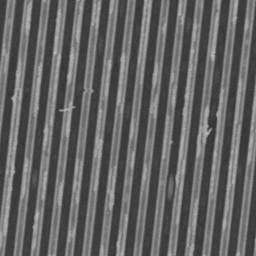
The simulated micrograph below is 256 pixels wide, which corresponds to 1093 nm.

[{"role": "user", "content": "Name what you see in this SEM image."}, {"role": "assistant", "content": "parallel lines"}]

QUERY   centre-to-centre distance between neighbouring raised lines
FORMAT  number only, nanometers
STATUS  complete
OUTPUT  72.8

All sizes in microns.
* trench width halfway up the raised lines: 0.0467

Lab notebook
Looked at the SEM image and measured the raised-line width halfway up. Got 0.0276 micrometres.